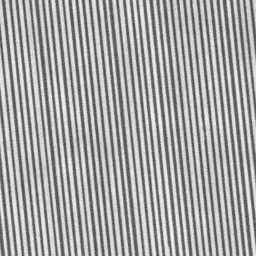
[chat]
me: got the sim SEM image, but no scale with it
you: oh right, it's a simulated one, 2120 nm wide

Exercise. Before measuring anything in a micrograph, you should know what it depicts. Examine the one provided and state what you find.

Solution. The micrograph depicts parallel lines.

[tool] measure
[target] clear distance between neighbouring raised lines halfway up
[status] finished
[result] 0.0298 um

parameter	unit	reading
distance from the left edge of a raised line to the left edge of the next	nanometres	55.2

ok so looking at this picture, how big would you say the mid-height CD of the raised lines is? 22.6 nm